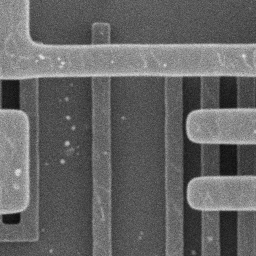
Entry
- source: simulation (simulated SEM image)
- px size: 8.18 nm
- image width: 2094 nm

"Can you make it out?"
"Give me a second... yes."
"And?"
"wiring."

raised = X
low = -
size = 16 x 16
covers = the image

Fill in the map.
XX--------------
XX--------------
XX--------------
XXXXXXXXXXXXXXXX
XXXXXXXXXXXXXXXX
----------------
----------------
XX----------XXXX
XX----------XXXX
XX--------------
XX--------------
XX----------XXXX
XX----------XXXX
----------------
----------------
----------------